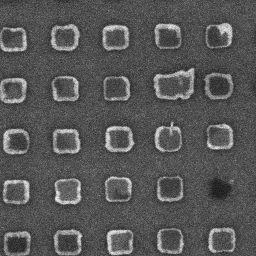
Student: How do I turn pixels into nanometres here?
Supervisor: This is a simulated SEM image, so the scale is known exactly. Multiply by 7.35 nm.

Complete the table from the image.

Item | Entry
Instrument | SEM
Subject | a regular array of raised bodies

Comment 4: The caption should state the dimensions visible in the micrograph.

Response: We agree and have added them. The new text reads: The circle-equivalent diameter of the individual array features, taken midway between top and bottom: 198 nanometres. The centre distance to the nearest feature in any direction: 369 nm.